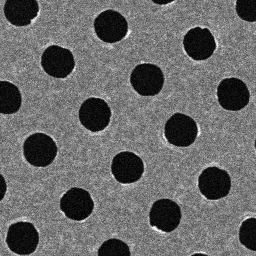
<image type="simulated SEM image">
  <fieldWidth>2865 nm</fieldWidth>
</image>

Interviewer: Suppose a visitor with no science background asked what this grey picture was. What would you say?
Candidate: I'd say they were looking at a regular array of holes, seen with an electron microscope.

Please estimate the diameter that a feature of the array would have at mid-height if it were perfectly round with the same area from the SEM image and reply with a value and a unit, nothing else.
369 nm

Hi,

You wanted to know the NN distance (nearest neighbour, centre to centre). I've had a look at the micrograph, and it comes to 60.8 px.